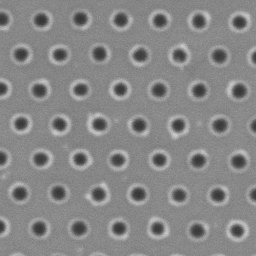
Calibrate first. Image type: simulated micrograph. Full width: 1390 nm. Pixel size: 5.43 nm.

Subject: a regular array of raised bodies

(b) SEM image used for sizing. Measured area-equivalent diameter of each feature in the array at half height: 0.112 um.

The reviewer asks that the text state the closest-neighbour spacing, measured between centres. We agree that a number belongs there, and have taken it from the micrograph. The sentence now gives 0.211 micrometres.